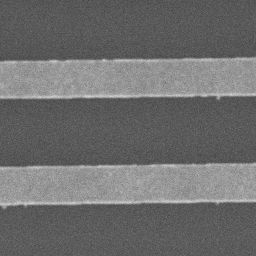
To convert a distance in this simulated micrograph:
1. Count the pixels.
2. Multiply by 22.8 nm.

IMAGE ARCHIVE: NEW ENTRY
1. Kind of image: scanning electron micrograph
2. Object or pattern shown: lines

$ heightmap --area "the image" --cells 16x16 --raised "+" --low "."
................
................
................
................
++++++++++++++++
++++++++++++++++
................
................
................
................
++++++++++++++++
++++++++++++++++
++++++++++++++++
................
................
................